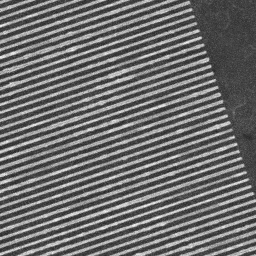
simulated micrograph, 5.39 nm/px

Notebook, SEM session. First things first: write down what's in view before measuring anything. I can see parallel lines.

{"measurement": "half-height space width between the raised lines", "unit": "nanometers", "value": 27.4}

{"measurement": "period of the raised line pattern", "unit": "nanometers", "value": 40.2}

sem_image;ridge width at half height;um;0.0128